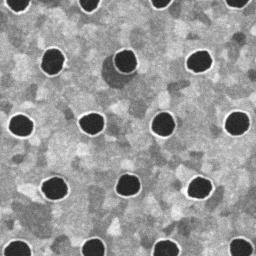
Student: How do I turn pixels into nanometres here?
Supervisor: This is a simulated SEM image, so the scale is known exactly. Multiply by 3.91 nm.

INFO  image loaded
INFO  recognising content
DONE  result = a regular array of holes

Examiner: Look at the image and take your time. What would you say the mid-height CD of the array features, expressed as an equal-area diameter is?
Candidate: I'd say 97.3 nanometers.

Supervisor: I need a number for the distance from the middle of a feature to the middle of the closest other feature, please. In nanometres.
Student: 278